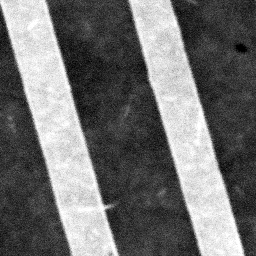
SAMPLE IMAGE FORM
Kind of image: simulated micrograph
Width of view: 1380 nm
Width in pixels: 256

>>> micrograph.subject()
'one or a few lines or trenches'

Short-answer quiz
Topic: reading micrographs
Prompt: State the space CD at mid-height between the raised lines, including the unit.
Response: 449 nm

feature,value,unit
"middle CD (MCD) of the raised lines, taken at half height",0.213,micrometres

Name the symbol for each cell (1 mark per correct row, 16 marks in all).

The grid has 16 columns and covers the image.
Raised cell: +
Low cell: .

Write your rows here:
+++.....+++.....
+++......++.....
.++......++.....
.+++.....+++....
.+++.....+++....
..++......++....
..+++.....++....
..+++.....+++...
..+++......++...
...++......++...
...+++.....+++..
...+++.....+++..
....++......++..
....+++.....++..
....+++.....+++.
....+++......++.